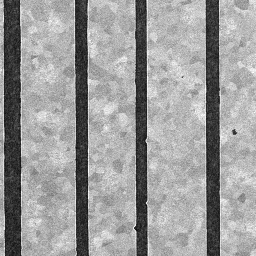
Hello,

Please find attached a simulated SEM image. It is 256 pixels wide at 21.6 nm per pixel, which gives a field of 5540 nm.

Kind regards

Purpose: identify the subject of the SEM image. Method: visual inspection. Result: one or a few lines or trenches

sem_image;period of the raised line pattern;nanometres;1390